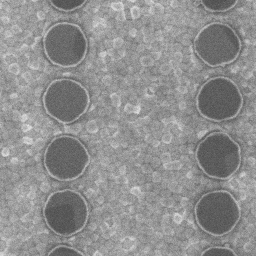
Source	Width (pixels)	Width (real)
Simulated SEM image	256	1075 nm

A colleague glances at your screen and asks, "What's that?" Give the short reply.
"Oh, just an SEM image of a regular array of raised bodies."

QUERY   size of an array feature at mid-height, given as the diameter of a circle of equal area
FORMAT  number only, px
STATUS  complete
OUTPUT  44.3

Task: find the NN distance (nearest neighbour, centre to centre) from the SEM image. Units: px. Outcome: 55.4